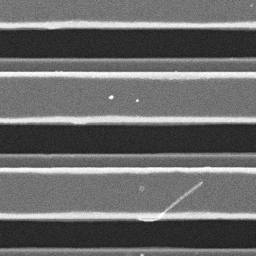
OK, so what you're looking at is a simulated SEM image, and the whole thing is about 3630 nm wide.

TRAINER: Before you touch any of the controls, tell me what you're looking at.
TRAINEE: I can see lines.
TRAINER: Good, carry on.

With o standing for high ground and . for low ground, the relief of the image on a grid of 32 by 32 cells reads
oooooooooooooooooooooooooooooooo
oooooooooooooooooooooooooooooooo
oooooooooooooooooooooooooooooooo
......o.........................
................................
................................
................................
oooooooooooooooooooooooooooooooo
oooooooooooooooooooooooooooooooo
oooooooooooooooooooooooooooooooo
oooooooooooooooooooooooooooooooo
oooooooooooooooooooooooooooooooo
oooooooooooooooooooooooooooooooo
oooooooooooooooooooooooooooooooo
oooooooooooooooooooooooooooooooo
................................
................................
................................
................................
oooooooooooooooooooooooooooooooo
oooooooooooooooooooooooooooooooo
oooooooooooooooooooooooooooooooo
oooooooooooooooooooooooooooooooo
oooooooooooooooooooooooooooooooo
oooooooooooooooooooooooooooooooo
oooooooooooooooooooooooooooooooo
oooooooooooooooooooooooooooooooo
.................ooo............
................................
................................
................................
oooooooooooooooooooooooooooooooo